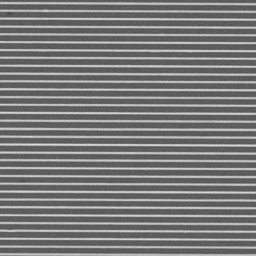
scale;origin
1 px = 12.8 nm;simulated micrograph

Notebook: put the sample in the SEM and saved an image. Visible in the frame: parallel lines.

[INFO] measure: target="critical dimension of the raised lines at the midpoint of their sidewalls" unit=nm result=20.8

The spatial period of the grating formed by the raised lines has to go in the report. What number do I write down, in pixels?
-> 7.84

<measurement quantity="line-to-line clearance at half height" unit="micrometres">0.0752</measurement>